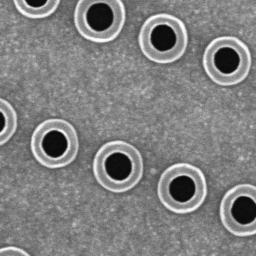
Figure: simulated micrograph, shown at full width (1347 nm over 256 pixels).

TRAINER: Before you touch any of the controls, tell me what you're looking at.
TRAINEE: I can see ring-shaped raised bodies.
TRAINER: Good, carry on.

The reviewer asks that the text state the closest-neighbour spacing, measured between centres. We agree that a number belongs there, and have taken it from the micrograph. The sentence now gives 356 nanometres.